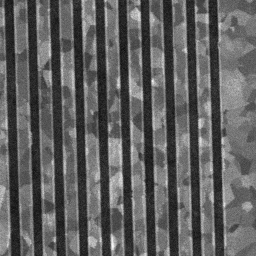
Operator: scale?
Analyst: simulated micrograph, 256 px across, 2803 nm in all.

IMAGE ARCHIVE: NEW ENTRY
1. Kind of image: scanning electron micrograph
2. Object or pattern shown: parallel lines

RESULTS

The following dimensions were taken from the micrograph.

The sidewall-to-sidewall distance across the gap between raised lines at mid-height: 111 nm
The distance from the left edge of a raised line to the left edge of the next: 0.248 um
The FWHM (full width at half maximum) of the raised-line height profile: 142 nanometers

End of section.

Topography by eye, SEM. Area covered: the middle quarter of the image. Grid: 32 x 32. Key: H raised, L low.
HHLLLHHHLLLHHHLLHHHLLLHHHLLLHHHL
HHLLLHHHLLLHHHLLHHHLLLHHHLLLHHHL
HHLLLHHHLLLHHHLLLHHLLLHHHLLLHHHL
HHLLLHHHLLLHHHLLLHHLLLHHHLLLHHHL
HHLLLHHHLLLHHHLLLHHLLLHHHLLLHHHL
HHLLLHHHLLLHHHLLLHHLLLHHHLLLHHHL
HHLLLHHHLLLHHHLLLHHLLLHHHLLLHHHL
HHHLLHHHLLLHHHLLLHHLLLHHHLLLHHHL
HHHLLHHHLLLHHHLLLHHLLLHHHLLLHHHL
HHHLLHHHLLLHHHLLLHHLLLHHHLLLHHHL
HHHLLHHHLLLHHHLLLHHHLLHHHLLLHHHL
HHHLLHHHLLLHHHLLLHHHLLHHHLLLHHHL
HHHLLHHHLLLHHHLLLHHHLLHHHLLLHHHL
HHHLLHHHLLLHHHLLLHHHLLHHHLLLHHHL
HHHLLHHHLLLHHHLLLHHHLLHHHLLLHHHL
HHHLLLHHLLLHHHLLLHHHLLHHHLLLHHHL
HHHLLLHHLLLHHHLLLHHHLLHHHLLLHHHL
HHHLLLHHLLLHHHLLLHHHLLHHHLLLHHHL
HHHLLLHHLLLHHHLLLHHHLLLHHLLLHHHL
HHHLLLHHLLLHHHLLLHHHLLLHHLLLHHHL
HHHLLLHHLLLHHHLLLHHHLLLHHLLLHHHL
HHHLLLHHLLLHHHLLLHHHLLLHHLLLHHHL
HHHLLLHHLLLHHHLLLHHHLLLHHLLLHHHL
HHHLLLHHHLLHHHLLLHHHLLLHHLLLHHHL
HHHLLLHHHLLHHHLLLHHHLLLHHLLLHHHL
HHHLLLHHHLLHHHLLLHHHLLLHHLLLHHHL
HHHLLLHHHLLHHHLLLHHHLLLHHHLLHHHL
HHHLLLHHHLLHHHLLLHHHLLLHHHLLHHHL
HHHLLLHHHLLHHHLLLHHHLLLHHHLLHHHL
HHHLLLHHHLLHHHLLLHHHLLLHHHLLHHHL
HHHLLLHHHLLHHHLLLHHHLLLHHHLLHHHL
HHHLLLHHHLLLHHHLLHHHLLLHHHLLHHHL